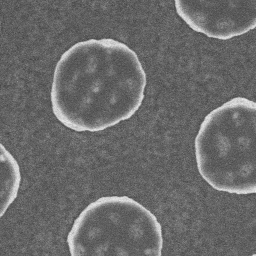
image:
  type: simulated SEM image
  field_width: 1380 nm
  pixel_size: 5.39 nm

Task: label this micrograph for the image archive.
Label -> raised bodies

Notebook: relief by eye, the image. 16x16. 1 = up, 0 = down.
0000000000011111
0000000000001111
0000000000000000
0000111110000000
0001111110000000
0001111110000000
0001111110000011
0000111100000111
0000000000001111
1000000000001111
1000000000001111
1000000000000111
1000001100000000
0000011111000000
0000111111000000
0000111111000000